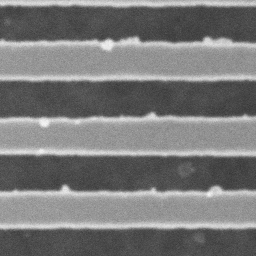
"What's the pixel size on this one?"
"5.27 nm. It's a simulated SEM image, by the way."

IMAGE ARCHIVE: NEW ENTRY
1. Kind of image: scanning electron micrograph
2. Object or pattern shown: lines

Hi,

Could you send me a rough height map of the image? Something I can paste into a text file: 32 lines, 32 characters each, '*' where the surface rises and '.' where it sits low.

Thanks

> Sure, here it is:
*********.**********************
................................
................................
................................
................................
********************************
********************************
********************************
********************************
********************************
................................
................................
................................
................................
................................
********************************
********************************
********************************
********************************
................................
................................
................................
................................
................................
********************************
********************************
********************************
********************************
*******.....*.**................
................................
................................
................................